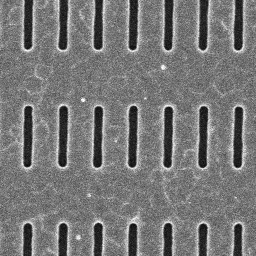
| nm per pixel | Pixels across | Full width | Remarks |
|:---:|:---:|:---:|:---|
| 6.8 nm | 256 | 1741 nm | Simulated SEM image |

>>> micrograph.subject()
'holes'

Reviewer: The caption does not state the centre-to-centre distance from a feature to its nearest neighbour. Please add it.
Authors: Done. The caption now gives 237 nm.